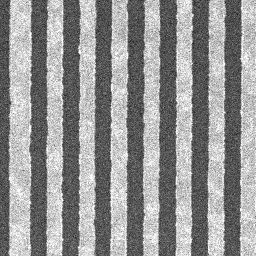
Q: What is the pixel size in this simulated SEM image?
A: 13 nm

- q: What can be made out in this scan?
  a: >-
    parallel lines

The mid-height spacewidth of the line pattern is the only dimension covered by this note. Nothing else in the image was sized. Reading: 226 nanometers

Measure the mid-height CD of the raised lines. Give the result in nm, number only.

187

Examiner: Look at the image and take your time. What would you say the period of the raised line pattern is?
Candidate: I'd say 427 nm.